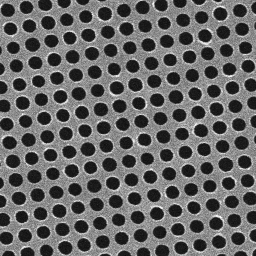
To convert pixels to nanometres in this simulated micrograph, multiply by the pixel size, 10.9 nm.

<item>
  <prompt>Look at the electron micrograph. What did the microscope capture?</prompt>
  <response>a regular array of holes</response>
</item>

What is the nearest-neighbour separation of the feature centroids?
202 nm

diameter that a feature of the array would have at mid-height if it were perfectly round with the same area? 13.6 pixels